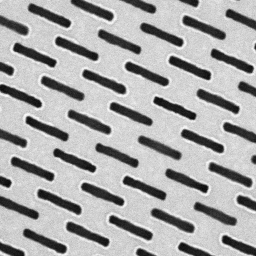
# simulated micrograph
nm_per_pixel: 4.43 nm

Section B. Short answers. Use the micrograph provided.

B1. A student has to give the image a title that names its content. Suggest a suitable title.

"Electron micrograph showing a regular array of holes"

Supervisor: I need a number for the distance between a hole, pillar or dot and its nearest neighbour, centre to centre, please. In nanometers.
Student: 187